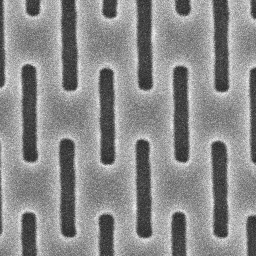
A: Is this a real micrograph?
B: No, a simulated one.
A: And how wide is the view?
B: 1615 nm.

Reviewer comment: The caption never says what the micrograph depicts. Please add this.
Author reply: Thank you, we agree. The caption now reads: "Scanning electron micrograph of holes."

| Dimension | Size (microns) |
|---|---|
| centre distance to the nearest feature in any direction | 0.479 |